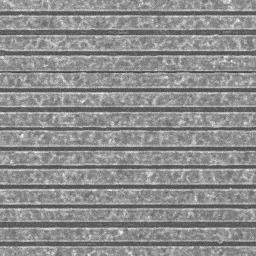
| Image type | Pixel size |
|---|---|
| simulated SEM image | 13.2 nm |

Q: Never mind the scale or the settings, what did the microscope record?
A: parallel lines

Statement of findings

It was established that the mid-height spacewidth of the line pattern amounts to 79.2 nanometers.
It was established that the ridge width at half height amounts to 185 nm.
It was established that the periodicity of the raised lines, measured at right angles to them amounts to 19.3 pixels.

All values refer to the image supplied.